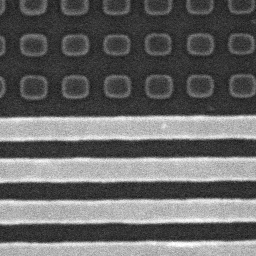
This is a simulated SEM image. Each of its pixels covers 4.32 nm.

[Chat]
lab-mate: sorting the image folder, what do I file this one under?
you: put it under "wiring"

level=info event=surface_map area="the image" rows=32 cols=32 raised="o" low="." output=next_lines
o..ooo..ooo..ooo..ooo..oooo..ooo
...oo...ooo..ooo...oo...oo...oo.
................................
................................
...oo....o....o....oo...oo...oo.
o..ooo..ooo..ooo..ooo..oooo..ooo
...ooo..ooo..ooo...oo...oo...oo.
................................
................................
...................oo...oo...oo.
o..ooo..ooo..ooo..ooo..oooo..ooo
...ooo..ooo..ooo..ooo...oo...ooo
................................
................................
................................
oooooooooooooooooooooooooooooooo
oooooooooooooooooooooooooooooooo
oooo............................
................................
................................
oooooooooooooooooooooooooooooooo
oooooooooooooooooooooooooooooooo
oooooooooooooooooooo...oooo.....
................................
................................
oooooooooooooooooooooooooooooooo
oooooooooooooooooooooooooooooooo
oooooooooooooooooooooooooooooooo
................................
................................
ooooo.oooooooooooooooooooooooooo
oooooooooooooooooooooooooooooooo